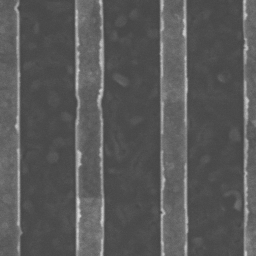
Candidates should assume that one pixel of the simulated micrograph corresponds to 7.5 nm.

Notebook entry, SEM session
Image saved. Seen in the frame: one or a few lines or trenches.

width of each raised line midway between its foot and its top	200	nm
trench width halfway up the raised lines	427	nanometers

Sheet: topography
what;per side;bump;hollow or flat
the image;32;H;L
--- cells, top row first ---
HHLLLLLLLLHHHLLLLLLLHHHLLLLLLLHH
HHLLLLLLLLHHHLLLLLLLHHHLLLLLLLHH
HHLLLLLLLHHHHLLLLLLLHHHLLLLLLLHH
HHLLLLLLLHHHHLLLLLLLHHHLLLLLLLHH
HHLLLLLLLHHHHLLLLLLLHHHLLLLLLLLH
HHLLLLLLLLHHHLLLLLLLHHHLLLLLLLLH
HHLLLLLLLLHHHLLLLLLLHHHLLLLLLLHH
HHLLLLLLLLHHHLLLLLLLHHHLLLLLLLLH
HHLLLLLLLLHHHLLLLLLLHHHLLLLLLLLH
HHLLLLLLLLHHHLLLLLLLHHHLLLLLLLLH
HHLLLLLLLLHHHLLLLLLLHHHLLLLLLLLH
HHLLLLLLLLHHHLLLLLLLHHHLLLLLLLLH
HHLLLLLLLLHHHLLLLLLLHHHLLLLLLLLH
HHLLLLLLLLHHHLLLLLLLHHHLLLLLLLLH
HHLLLLLLLLHHHLLLLLLLHHHLLLLLLLLH
HHLLLLLLLHHHHLLLLLLLHHHLLLLLLLLH
HHLLLLLLLLHHHLLLLLLLHHHLLLLLLLLH
HHLLLLLLLLHHHLLLLLLLHHHLLLLLLLLH
HHLLLLLLLLHHHLLLLLLLHHHLLLLLLLLH
HHLLLLLLLLHHHLLLLLLLHHHLLLLLLLLH
HHLLLLLLLLHHHLLLLLLLHHHLLLLLLLLH
HHLLLLLLLLHHHLLLLLLLHHHLLLLLLLLH
HHLLLLLLLLHHHLLLLLLLHHHLLLLLLLLH
HHLLLLLLLLHHHLLLLLLLHHHLLLLLLLLH
HHLLLLLLLLHHHLLLLLLLHHHLLLLLLLLH
HHLLLLLLLLHHHLLLLLLLHHHLLLLLLLLH
HHLLLLLLLLHHHLLLLLLLHHHLLLLLLLLH
HHLLLLLLLLHHHLLLLLLLHHHLLLLLLLLH
HHHLLLLLLLHHHLLLLLLLHHHLLLLLLLLH
HHHLLLLLLLHHHLLLLLLLHHHLLLLLLLLH
HHLLLLLLLLHHHLLLLLLLHHHLLLLLLLLH
HHLLLLLLLLHHHLLLLLLLHHHLLLLLLLLH